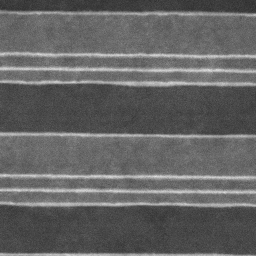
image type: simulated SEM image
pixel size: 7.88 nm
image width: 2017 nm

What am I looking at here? lines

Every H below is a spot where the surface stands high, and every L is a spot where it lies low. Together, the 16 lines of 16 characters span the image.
LLLLLLLLLLLLLLLL
HHHHHHHHHHHHHHHH
HHHHHHHHHHHHHHHH
HHHHHHHHHHHHHHHH
HHHHHHHHHHHHHHHH
LLLLLLLLLLLLLLLL
LLLLLLLLLLLLLLLL
LLLLLLLLLLLLLLLL
HHHHHHHHHHHHLLLL
HHHHHHHHHHHHHHHH
HHHHHHHHHHHHHHHH
HHHHHHHHHHHHHHHH
HHHHHHHHHHHHHHHH
LLLLLLLLLLLLLLLL
LLLLLLLLLLLLLLLL
LLLLLLLLLLLLLLLL